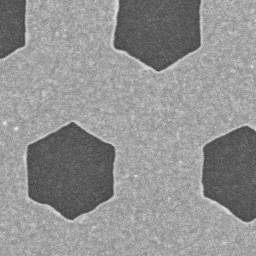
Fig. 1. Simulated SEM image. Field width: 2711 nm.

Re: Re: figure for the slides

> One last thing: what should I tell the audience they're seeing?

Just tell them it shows holes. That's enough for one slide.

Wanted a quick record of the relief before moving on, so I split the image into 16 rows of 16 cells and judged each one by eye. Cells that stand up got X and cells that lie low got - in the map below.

--XXXXX------XXX
--XXXXX------XXX
--XXXXX------XXX
XXXXXXXX----XXXX
XXXXXXXXXXXXXXXX
XXXXXXXXXXXXXXXX
XXXXXXXXXXXXXXXX
XXXXXXXXXXXXXXXX
XXX---XXXXXXXX--
XX-----XXXXXX---
XX-----XXXXXX---
XX-----XXXXXX---
XX-----XXXXXX---
XXXX-XXXXXXXXXX-
XXXXXXXXXXXXXXXX
XXXXXXXXXXXXXXXX